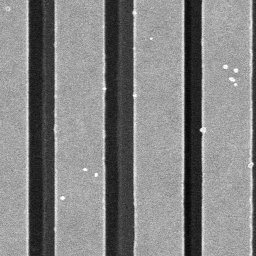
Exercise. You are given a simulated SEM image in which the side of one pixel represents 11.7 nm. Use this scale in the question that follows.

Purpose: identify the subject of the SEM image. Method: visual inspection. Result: lines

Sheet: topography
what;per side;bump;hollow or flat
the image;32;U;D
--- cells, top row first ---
UUUDDDDUUUUUUDDDDUUUUUUDDUUUUUUD
UUUDDDDUUUUUUDDDDUUUUUUDDUUUUUUD
UUUDDDDUUUUUUDDDDUUUUUUDDUUUUUUD
UUUDDDDUUUUUUDDDDUUUUUUDDUUUUUUD
UUUDDDDUUUUUUDDDDUUUUUUDDUUUUUUD
UUUDDDDUUUUUUDDDDUUUUUUDDUUUUUUD
UUUDDDDUUUUUUDDDDUUUUUUDDUUUUUUD
UUUDDDDUUUUUUDDDDUUUUUUDDUUUUUUD
UUUDDDDUUUUUUDDDDUUUUUUDDUUUUUUD
UUUDDDDUUUUUUDDDDUUUUUUDDUUUUUUD
UUUDDDDUUUUUUDDDDUUUUUUDDUUUUUUD
UUUDDDDUUUUUUDDDDUUUUUUDDUUUUUUD
UUUDDDDUUUUUUDDDDUUUUUUDDUUUUUUD
UUUDDDDUUUUUUDDDDUUUUUUDDUUUUUUD
UUUDDDDUUUUUUDDDDUUUUUUDDUUUUUUD
UUUDDDDUUUUUUDDDDUUUUUUDDUUUUUUD
UUUDDDDUUUUUUDDDDUUUUUUDDUUUUUUD
UUUDDDDUUUUUUDDDDUUUUUUDDUUUUUUD
UUUDDDDUUUUUUDDDDUUUUUUDDUUUUUUD
UUUDDDDUUUUUUDDDDUUUUUUDDUUUUUUD
UUUDDDDUUUUUUDDDDUUUUUUDDUUUUUUD
UUUDDDDUUUUUUDDDDUUUUUUDDUUUUUUD
UUUDDDDUUUUUUDDDDUUUUUUDDUUUUUUD
UUUDDDDUUUUUUDDDDUUUUUUDDUUUUUUD
UUUDDDDUUUUUUDDDDUUUUUUDDUUUUUUD
UUUDDDDUUUUUUDDDDUUUUUUDDUUUUUUD
UUUDDDDUUUUUUDDDDUUUUUUDDUUUUUUD
UUUDDDDUUUUUUDDDDUUUUUUDDUUUUUUD
UUUDDDDUUUUUUDDDDUUUUUUDDUUUUUUD
UUUDDDDUUUUUUDDDDUUUUUUDDUUUUUUD
UUUDDDDUUUUUUDDDDUUUUUUDDUUUUUUD
UUUDDDDUUUUUUDDDDUUUUUUDDUUUUUUD